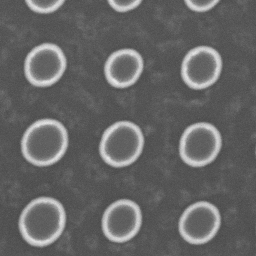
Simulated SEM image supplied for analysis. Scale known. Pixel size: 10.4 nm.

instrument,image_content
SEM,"a regular array of raised bodies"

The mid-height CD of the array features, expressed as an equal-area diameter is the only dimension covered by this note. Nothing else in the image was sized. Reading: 0.399 microns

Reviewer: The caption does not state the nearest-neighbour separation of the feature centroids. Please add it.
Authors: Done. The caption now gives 796 nanometers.